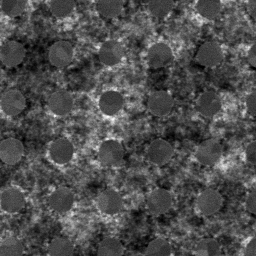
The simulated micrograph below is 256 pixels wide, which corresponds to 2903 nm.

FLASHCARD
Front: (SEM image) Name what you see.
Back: a regular array of raised bodies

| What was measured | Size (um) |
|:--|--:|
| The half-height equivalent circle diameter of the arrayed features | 0.285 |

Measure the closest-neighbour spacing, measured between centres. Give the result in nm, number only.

552